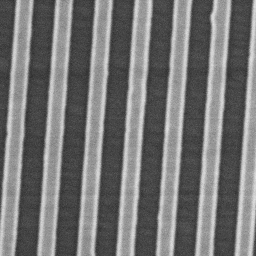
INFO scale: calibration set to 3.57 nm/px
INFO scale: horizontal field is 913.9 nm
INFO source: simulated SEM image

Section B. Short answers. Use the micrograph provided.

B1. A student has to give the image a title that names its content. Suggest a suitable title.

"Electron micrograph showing parallel lines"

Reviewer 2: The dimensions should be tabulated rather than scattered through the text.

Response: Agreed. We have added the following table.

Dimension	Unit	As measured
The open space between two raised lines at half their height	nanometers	92.4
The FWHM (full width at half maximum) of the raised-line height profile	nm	50.7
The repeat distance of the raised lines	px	39.4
